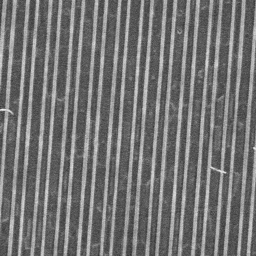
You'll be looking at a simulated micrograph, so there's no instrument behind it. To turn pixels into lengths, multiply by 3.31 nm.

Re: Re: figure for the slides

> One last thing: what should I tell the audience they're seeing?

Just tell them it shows parallel lines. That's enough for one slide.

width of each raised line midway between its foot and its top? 0.0103 µm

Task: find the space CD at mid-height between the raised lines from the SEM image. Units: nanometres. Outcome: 24.1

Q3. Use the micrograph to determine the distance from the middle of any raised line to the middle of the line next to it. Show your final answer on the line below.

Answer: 37.9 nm